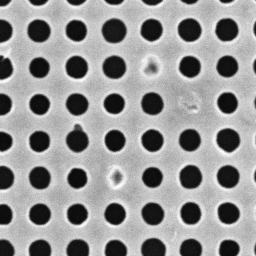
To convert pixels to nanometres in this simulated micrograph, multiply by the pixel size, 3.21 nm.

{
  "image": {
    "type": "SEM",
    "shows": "a regular array of holes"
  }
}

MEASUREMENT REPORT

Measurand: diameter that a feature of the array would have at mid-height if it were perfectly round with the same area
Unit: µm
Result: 0.07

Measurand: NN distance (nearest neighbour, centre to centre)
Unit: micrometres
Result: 0.117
